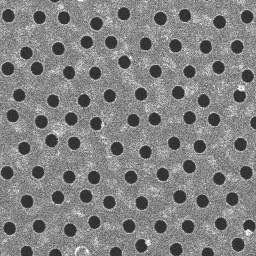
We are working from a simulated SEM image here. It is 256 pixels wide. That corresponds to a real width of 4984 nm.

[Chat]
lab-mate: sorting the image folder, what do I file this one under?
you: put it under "a regular array of holes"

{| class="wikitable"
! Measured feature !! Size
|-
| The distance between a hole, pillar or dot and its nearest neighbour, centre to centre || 473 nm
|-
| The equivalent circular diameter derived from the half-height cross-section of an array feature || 254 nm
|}